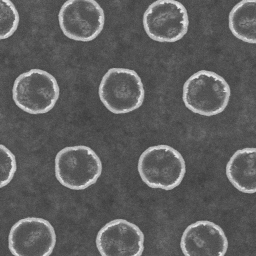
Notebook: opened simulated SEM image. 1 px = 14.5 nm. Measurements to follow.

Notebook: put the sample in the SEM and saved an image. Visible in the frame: raised bodies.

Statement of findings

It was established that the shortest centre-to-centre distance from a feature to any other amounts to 1230 nanometres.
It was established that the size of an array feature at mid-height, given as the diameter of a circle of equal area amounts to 616 nm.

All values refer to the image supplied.